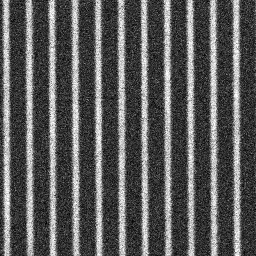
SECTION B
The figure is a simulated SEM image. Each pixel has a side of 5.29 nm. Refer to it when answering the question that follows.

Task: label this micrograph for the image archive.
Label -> parallel lines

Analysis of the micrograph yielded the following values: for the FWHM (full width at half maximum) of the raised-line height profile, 33.7 nm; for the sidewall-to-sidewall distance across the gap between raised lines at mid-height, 86.7 nm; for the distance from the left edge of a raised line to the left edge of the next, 122 nm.